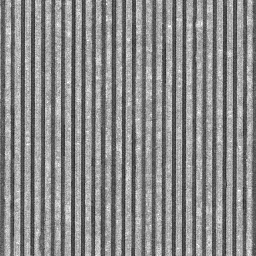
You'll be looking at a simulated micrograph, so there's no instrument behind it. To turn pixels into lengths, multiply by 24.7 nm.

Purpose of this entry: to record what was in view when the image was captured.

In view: parallel lines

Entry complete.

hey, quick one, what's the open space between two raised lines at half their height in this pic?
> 0.114 µm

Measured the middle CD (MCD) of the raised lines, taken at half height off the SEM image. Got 139 nanometers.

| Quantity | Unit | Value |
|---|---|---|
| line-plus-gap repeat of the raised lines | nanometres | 249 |